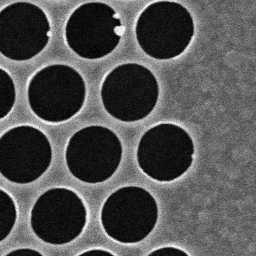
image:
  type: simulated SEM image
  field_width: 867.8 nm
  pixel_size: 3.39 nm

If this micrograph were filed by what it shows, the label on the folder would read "a regular array of holes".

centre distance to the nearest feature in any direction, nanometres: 240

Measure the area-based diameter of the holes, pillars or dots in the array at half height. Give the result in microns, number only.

0.192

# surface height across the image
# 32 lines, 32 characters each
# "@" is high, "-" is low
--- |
@@--@@@@@@@--@@@@@@---@@@@@@@@@@
-----@@@@-----@@@@------@@@@@@@@
------@@@------@@-------@@@@@@@@
------@@-------@@-------@@@@@@@@
------@@-------@@-------@@@@@@@@
------@@@------@@------@@@@@@@@@
-----@@@@-----@@@@-----@@@@@@@@@
@@-@@@@@@@@@@@@@@@@@@@@@@@@@@@@@
@@@@@@---@@@@@@---@@@@@@@@@@@@@@
-@@@------@@@------@@@@@@@@@@@@@
--@@------@@@-------@@@@@@@@@@@@
--@--------@@-------@@@@@@@@@@@@
--@@------@@@-------@@@@@@@@@@@@
-@@@------@@@------@@@@@@@@@@@@@
-@@@@----@@@@@----@@@@@@@@@@@@@@
@@@@@@@@@@@@@@@@@@@@-@@@@@@@@@@@
@----@@@@@----@@@@-----@@@@@@@@@
------@@@------@@@------@@@@@@@@
------@@-------@@-------@@@@@@@@
------@@-------@@-------@@@@@@@@
------@@-------@@-------@@@@@@@@
------@@@-----@@@@-----@@@@@@@@@
@---@@@@@@---@@@@@@@--@@@@@@@@@@
@@@@@@@-@@@@@@@---@@@@@@@@@@@@@@
-@@@@-----@@@@-----@@@@@@@@@@@@@
--@@------@@@-------@@@@@@@@@@@@
--@@-------@@-------@@@@@@@@@@@@
--@@-------@@-------@@@@@@@@@@@@
--@@------@@@------@@@@@@@@@@@@@
-@@@@-----@@@@----@@@@@@@@@@@@@@
@@@@@@@@@@@@@@@@@@@@@@@@@@@@@@@@
@----@@@@@@--@@@@@@----@@@@@@@@@